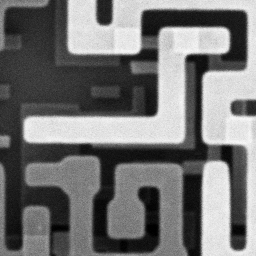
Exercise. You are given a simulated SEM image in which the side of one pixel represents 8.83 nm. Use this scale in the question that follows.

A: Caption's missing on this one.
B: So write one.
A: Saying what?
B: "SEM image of wiring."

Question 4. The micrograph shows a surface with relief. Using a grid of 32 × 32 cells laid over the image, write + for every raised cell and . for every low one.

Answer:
++++++...+++..++++++++++++++++++
+........+++..++++.............+
.........+++..++++.............+
.........+++++++++...++.++++...+
.........+++++++++..+++++++++..+
.........++++++++...+++++++++..+
.........++++++++...++++++++...+
....................+++........+
....................+++........+
....................+++...++++++
....................+++..+++++++
....................+++..+++++++
....................+++..++++...
....................+++..++++...
...................++++..++++...
...++++++++++++++++++++..+++++++
...++++++++++++++++++++..+++++++
...++++++++++++++++++++..+++++++
...............................+
...............................+
....++++++++...++.........++...+
...+++++++++..+++++++++...+++..+
+..+++++++++..+++++++++..++++..+
+.......++++..++++..+++..++++..+
+........+++..+++...+++..++++..+
+........+++..++++..+++..++++..+
+..+++...+++..++++..+++..++++..+
+..+++...+++..++++..+++..++++..+
+..+++...++...++++..+++..++++..+
+..+++...+++..++++..+++..++++..+
+..+++...+++........+++..++++..+
++++++...+++.......++++..+++++++